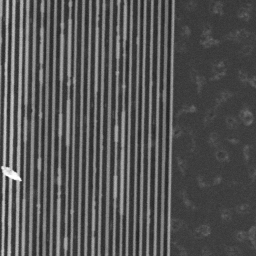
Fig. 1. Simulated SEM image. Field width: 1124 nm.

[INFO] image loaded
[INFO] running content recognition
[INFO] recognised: parallel lines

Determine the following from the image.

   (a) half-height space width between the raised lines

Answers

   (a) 20.9 nm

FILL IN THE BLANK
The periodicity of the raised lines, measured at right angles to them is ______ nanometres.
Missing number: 30.2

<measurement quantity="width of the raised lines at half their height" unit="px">2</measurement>